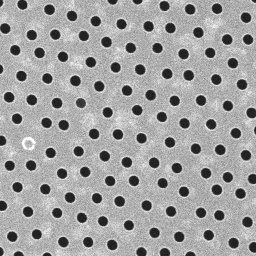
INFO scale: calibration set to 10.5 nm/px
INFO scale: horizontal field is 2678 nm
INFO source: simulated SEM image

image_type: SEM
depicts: a regular array of holes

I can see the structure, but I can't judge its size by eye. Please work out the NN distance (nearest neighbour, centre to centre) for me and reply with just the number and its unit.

0.239 um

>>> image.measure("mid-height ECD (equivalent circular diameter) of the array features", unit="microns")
0.112